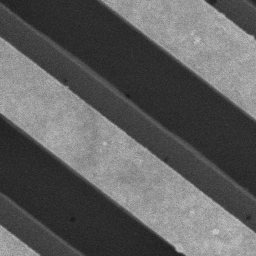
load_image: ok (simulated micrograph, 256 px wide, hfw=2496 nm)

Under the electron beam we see lines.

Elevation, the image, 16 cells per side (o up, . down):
.......ooooooooo
oo......oooooooo
ooo.......oooooo
oooo.......ooooo
oooooo......oooo
ooooooo......ooo
oooooooo.......o
.oooooooo.......
..ooooooooo.....
...ooooooooo....
....ooooooooo...
......ooooooooo.
o......ooooooooo
oo......oooooooo
ooo.......oooooo
oooo.......ooooo